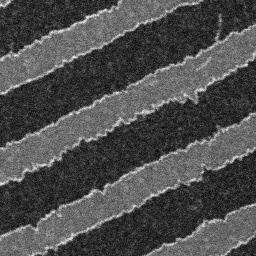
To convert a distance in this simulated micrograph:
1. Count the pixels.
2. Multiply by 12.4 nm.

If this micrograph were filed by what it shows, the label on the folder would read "one or a few lines or trenches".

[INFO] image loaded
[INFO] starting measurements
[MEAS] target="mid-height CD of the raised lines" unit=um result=0.609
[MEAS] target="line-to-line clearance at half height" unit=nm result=376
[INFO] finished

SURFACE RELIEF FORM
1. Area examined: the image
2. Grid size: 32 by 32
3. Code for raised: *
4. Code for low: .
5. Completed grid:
.**************.........********
*************........***********
***********........*************
*********........**************.
******.........**************...
****.........**************.....
***........**************.......
.........**************........*
.......**************.........**
.....**************.........****
...**************.........******
.**************..........*******
*************........*.*********
***********........*************
********.........**************.
*******.......****************..
*****........**************.....
***.......*****************.....
*........***************........
.......**************.........**
......*************.........****
...**************........*******
.**************.........********
*************........***********
***********........*************
*********.........**************
*******........**************...
*****........***************....
***........**************.......
.........***************........
.......***************........**
......*************.........****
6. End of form